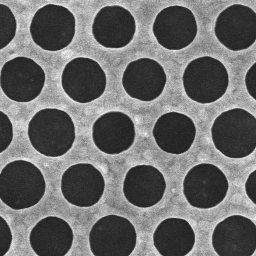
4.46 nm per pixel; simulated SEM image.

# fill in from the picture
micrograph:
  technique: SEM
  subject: a regular array of holes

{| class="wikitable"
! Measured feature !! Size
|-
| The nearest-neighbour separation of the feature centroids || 270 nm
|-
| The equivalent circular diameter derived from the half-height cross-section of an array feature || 198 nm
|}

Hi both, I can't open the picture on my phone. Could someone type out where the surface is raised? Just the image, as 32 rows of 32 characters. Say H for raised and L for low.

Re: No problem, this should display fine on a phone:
HHHHHHHHHHHHHHHHHHHHHHHHHHHHHHHH
LHHHHLLLLHHHLLLLHHHHLLLLHHHHLLLL
LLHHLLLLLHHHLLLLLHHLLLLLHHHLLLLL
LLHHLLLLLHHHLLLLLHHLLLLLLHHLLLLL
LLHHLLLLLHHHLLLLLHHLLLLLHHHLLLLL
LHHHHLLLLHHHLLLLHHHHLLLLHHHHLLLL
HHHHHHHHHHHHHHHHHHHHHHHHHHHHHHHH
HLLLHHHHHLLHHHHHHLLHHHHHLLLHHHHH
LLLLLHHHLLLLLHHHLLLLHHHLLLLLHHHL
LLLLLLHHLLLLLHHLLLLLLHHLLLLLLHHL
LLLLLHHHLLLLLHHLLLLLLHHLLLLLLHHL
HLLLLHHHLLLLLHHHLLLLHHHLLLLLHHHL
HHLLHHHHHLLLHHHHHLLHHHHHLLLHHHHH
HHHHHHLHHHHHHHHHHHHHHHHHHHHHHHHH
LHHHLLLLLHHHHLLLHHHHLLLHHHHLLLLL
LLHHLLLLLHHHLLLLLHHLLLLLHHHLLLLL
LLHLLLLLLHHHLLLLLHHLLLLLHHLLLLLL
LHHHLLLLLHHHLLLLLHHLLLLLHHHLLLLL
LHHHLLLLLHHHLLLLHHHHLLLLHHHLLLLL
HHHHHHLHHHHHHHHHHHHHHHHHHHHHLLLH
HLLLHHHHHLLHHHHHHHHHHHHHHLHHHHHH
LLLLLHHHLLLLLHHHLLLLHHHHLLLLHHHH
LLLLLLHHLLLLLHHHLLLLLHHLLLLLHHHL
LLLLLLHHLLLLLHHLLLLLLHHLLLLLLHHL
LLLLLHHHLLLLLHHHLLLLHHHLLLLLHHHL
HLLLHHHHHLLLHHHHHLLHHHHHLLLHHHHH
HHHHHHHHHHHHHHHHHHHHHHHHHHHHHHHH
LHHHHLLLHHHHLLLLHHHHHLLHHHHHLLLH
LHHHLLLLLHHLLLLLLHHHLLLLHHHLLLLL
LHHHLLLLLHHLLLLLLHHLLLLLHHHLLLLL
LHHHLLLLLHHLLLLLLHHLLLLLHHHLLLLL
LHHHLLLLLHHLLLLLLHHHLLLLHHHLLLLL